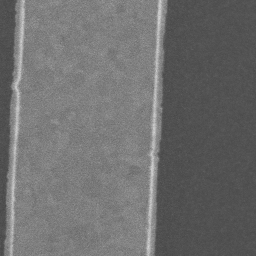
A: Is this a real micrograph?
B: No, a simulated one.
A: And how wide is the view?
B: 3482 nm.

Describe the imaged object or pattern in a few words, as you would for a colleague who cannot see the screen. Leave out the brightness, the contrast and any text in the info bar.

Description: one or a few lines or trenches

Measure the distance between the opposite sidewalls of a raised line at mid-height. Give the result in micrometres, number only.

1.86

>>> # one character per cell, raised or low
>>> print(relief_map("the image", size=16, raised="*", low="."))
.*********......
.*********......
.*********......
.*********......
.*********......
.*********......
.*********......
.*********......
.*********......
.*********......
.********.......
.********.......
.********.......
.********.......
.********.......
.********.......